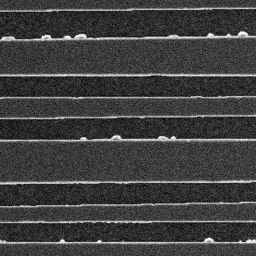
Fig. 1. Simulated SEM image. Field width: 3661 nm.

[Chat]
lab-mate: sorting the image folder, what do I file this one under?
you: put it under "lines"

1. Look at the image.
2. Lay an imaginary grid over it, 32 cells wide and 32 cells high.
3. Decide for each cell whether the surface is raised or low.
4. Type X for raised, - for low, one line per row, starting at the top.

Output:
XXXXXXXXXXXXXXXXXXXXXXXXXXXXXXXX
--------------------------------
--------------------------------
--------------------------------
-----------------------------XX-
XXXXXXXXXXXXXXXXXXXXXXXXXXXXXXXX
XXXXXXXXXXXXXXXXXXXXXXXXXXXXXXXX
XXXXXXXXXXXXXXXXXXXXXXXXXXXXXXXX
XXXXXXXXXXXXXXXXXXXXXXXXXXXXXXXX
--------------------------------
--------------------------------
--------------------------------
XXXXXXXXXXXXXXXXXXXXXXXXXXXXXXXX
XXXXXXXXXXXXXXXXXXXXXXXXXXXXXXXX
XXXXXXXXXXXXXXXXXXXXXXXXXX------
--------------------------------
--------------------------------
------------XXXXXXXXXXXXXXXXXXXX
XXXXXXXXXXXXXXXXXXXXXXXXXXXXXXXX
XXXXXXXXXXXXXXXXXXXXXXXXXXXXXXXX
XXXXXXXXXXXXXXXXXXXXXXXXXXXXXXXX
XXXXXXXXXXXXXXXXXXXXXXXXXXXXXXXX
XXXXXXXXXXXXXXXXXXXXXXXXXXXXXXXX
--------------------------------
--------------------------------
-----------------------XXXXXXXXX
XXXXXXXXXXXXXXXXXXXXXXXXXXXXXXXX
XXXXXXXXXXXXXXXXXXXXXXXXXXXXXXXX
--------------------------------
--------------------------------
XXXXXXXXXXXXXXXXXXXXXXXXXXXXXXXX
XXXXXXXXXXXXXXXXXXXXXXXXXXXXXXXX